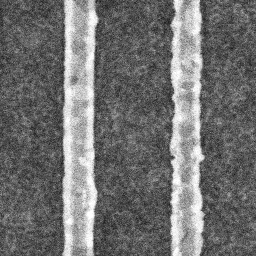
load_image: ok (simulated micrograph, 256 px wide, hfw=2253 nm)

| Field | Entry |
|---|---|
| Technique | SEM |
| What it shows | one or a few lines or trenches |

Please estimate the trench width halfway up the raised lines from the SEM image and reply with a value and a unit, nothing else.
759 nanometers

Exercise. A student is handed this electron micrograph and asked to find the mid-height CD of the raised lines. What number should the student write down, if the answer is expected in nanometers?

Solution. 189